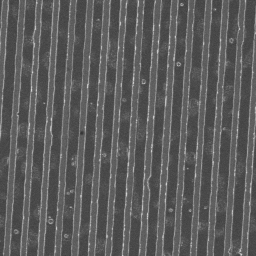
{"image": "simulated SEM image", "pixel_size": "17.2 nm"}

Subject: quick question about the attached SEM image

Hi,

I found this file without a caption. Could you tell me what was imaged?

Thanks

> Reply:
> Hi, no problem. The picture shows parallel lines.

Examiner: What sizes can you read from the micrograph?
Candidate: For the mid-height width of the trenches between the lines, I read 0.0987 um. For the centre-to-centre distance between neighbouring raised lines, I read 16.9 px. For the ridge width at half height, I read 189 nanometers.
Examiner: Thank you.